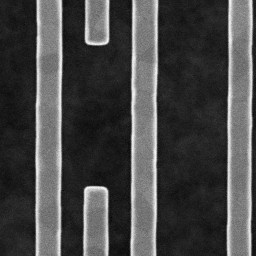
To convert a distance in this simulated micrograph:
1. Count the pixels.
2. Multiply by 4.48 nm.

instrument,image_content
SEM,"wiring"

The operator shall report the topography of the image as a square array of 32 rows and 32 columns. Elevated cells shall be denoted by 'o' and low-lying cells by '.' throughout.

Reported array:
.....ooo...ooo...ooo.........oo.
.....ooo...ooo...ooo.........oo.
.....ooo...ooo...ooo.........oo.
.....ooo...ooo...ooo.........oo.
.....ooo...ooo...ooo.........oo.
.....ooo...oo....ooo.........oo.
.....ooo.........ooo.........oo.
.....ooo.........ooo.........oo.
.....ooo.........ooo.........oo.
.....ooo.........ooo.........oo.
.....ooo........oooo.........oo.
.....ooo.........ooo.........oo.
.....ooo.........oo..........oo.
.....ooo........oooo.........oo.
.....ooo.........ooo.........oo.
.....ooo.........ooo.........oo.
.....ooo.........ooo.........oo.
.....ooo........oooo.........oo.
.....ooo........oooo.........oo.
.....ooo........oooo.........oo.
.....ooo........ooo..........oo.
.....ooo........oooo.........oo.
.....ooo........oooo.........oo.
.....ooo...oo...oooo.........oo.
.....oo....oo...oooo.........oo.
.....oo....oo...oooo.........oo.
.....ooo...oo...oooo.........oo.
.....ooo...oo...oooo.........oo.
.....oo....oo...ooo.........ooo.
.....oo....oo...ooo.........ooo.
.....oo....oo...ooo.........ooo.
.....oo....oo...ooo..........oo.